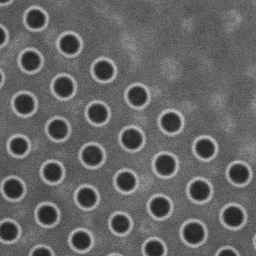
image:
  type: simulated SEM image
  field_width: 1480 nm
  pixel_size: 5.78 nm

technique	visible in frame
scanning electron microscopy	a regular array of raised bodies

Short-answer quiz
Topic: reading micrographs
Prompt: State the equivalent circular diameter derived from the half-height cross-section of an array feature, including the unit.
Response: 141 nm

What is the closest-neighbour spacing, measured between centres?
245 nm